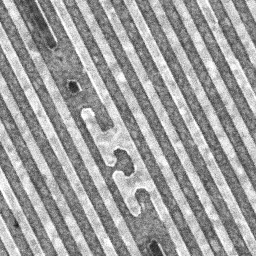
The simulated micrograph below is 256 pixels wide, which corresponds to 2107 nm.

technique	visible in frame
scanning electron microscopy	parallel lines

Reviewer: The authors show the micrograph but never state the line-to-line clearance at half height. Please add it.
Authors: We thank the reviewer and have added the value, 0.104 micrometres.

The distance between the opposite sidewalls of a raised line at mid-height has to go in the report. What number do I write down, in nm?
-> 71.7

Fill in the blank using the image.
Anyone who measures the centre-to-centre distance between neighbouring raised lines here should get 178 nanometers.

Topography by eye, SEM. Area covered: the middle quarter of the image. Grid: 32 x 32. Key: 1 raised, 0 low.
00000011000111000111000111000111
00000011000011000011000011000011
00000011100011100011100001100011
00000001100001100001100001100001
01100001110001110001110000110001
01110000110000110000110000110000
01110000111000111000111000011000
00100000011000011000011000011000
00000000011100011100011100001100
00000000001100001100001100001100
00000000001110001110001110000110
10000110000110000110000110000110
10001110000111000111000111000011
11000111000011000011000011000011
11000111000011100011100011100001
01100011100001100001100001100001
01100011100111110001110001110000
00110001111111110000110000110000
00110001111111111000111000111000
00011000111111111000011000011000
00011000111111111100011100011100
00001100011100011100001100001100
10001100011100001110001110001110
10000110001110000110000110000110
11000110001110000111000111000111
11000011000000000011000011000011
11100011100000000011100011100011
01100001100001100111100001100001
01110001110011111111110001110001
00110000110001111111110000110000
00110000111001111111111000111000
00011000011000111100011000011000